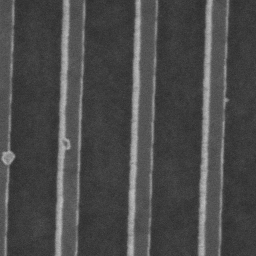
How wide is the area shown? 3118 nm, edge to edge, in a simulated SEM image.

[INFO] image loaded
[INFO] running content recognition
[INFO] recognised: lines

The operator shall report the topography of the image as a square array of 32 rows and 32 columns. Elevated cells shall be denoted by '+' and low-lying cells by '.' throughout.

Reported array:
++......+++......+++......+++...
++......+++......+++......+++...
++......+++......+++......++....
++......++.......+++......++....
++......++.......+++......++....
++......++.......++.......++....
++......++.......++.......++....
+.......++.......++.......++....
+.......++.......++.......++....
+.......++.......++.......++....
+.......++.......++.......++....
+.......++.......++.......++....
+.......++.......++.......++....
+.......++.......++.......++....
+.......++.......++.......++....
+.......++.......++.......++....
+.......++.......++.......++....
+.......++.......++.......++....
+.......++.......++......+++....
++......++.......++......+++....
+.......++.......++......+++....
+......+++......+++......+++....
+......+++......+++......+++....
+......+++......+++......+++....
+......+++......+++......+++....
+......+++......+++......+++....
+......+++......+++......+++....
+......+++......+++......+++....
+......+++......+++......+++....
+......+++......+++......+++....
+......+++......+++......++.....
+......+++......+++......++.....